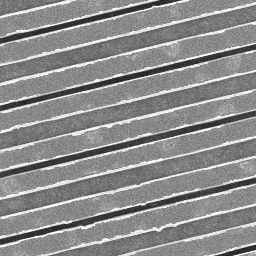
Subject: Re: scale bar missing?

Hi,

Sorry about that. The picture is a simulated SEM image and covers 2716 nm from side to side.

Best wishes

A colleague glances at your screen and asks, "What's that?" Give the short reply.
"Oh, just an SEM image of parallel lines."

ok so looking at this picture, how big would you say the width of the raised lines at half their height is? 0.219 micrometres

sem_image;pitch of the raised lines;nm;343